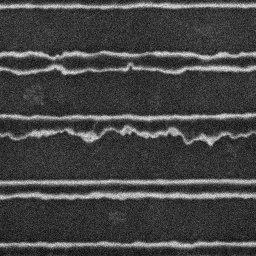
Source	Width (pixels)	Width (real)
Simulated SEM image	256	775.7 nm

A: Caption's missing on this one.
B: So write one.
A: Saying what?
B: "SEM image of one or a few lines or trenches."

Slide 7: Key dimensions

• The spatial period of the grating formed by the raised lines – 63.3 px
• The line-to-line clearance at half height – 141 nanometers